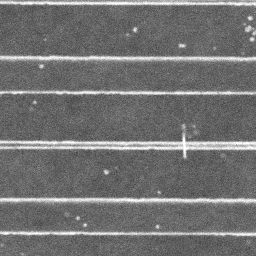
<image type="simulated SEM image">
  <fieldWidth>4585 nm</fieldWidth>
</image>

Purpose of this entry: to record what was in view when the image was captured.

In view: lines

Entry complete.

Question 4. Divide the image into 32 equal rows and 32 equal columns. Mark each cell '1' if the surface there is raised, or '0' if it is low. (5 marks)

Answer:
00000000000000000000000000000000
00000000000000000000000000000000
00000000000000000000000000000000
00000000000000000000000000000000
00000000000000000000000000000000
00000000000000000000000000000000
00000000000000000000000000000000
11111111111111111111111111111111
11111111111111111111111111111111
11111111111111111111111111111111
11111111111111111111111111111111
11111111111111111111111111111111
00000000000000000000000000000000
00000000000000000000000000000000
00000000000000000000000000000000
00000000000000000000000000000000
00000000000000000000000000000000
00000000000000000000000000000000
00000000000000000000010110111101
00000000000000000000000000000000
00000000000000000000000000000000
00000000000000000000000000000000
00000000000000000000000000000000
00000000000000000000000000000000
00000000000000000000000000000000
11111111111111111111111111111111
11111111111111111111111111111111
11111111111111111111111111111111
11111111111111111111111111111111
00000000000000000000000000000000
00000000000000000000000000000000
00000000000000000000000000000000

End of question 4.